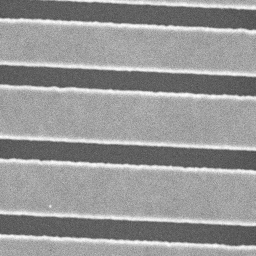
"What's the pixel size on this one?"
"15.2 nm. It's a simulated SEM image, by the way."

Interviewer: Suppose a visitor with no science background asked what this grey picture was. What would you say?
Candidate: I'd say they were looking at lines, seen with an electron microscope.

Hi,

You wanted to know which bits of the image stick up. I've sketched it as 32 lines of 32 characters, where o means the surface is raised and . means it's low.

..................oooooooooooooo
................................
oooooo..........................
oooooooooooooooooooooooooo......
oooooooooooooooooooooooooooooooo
oooooooooooooooooooooooooooooooo
oooooooooooooooooooooooooooooooo
oooooooooooooooooooooooooooooooo
..........oooooooooooooooooooooo
...............................o
................................
oooooooooooooooooo..............
oooooooooooooooooooooooooooooooo
oooooooooooooooooooooooooooooooo
oooooooooooooooooooooooooooooooo
oooooooooooooooooooooooooooooooo
oooooooooooooooooooooooooooooooo
...ooooooooooooooooooooooooooooo
..........................oooooo
................................
oooooooooooooo..................
oooooooooooooooooooooooooooooooo
oooooooooooooooooooooooooooooooo
oooooooooooooooooooooooooooooooo
oooooooooooooooooooooooooooooooo
oooooooooooooooooooooooooooooooo
oooooooooooooooooooooooooooooooo
................oooooooooooooooo
................................
oooo.o..........................
ooooooooooooooooooooooooo.......
oooooooooooooooooooooooooooooooo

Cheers